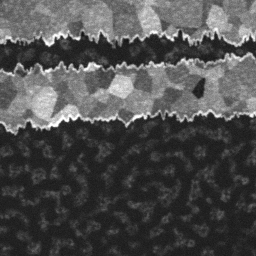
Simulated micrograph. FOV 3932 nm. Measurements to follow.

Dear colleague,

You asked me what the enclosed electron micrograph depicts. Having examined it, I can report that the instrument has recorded one or a few lines or trenches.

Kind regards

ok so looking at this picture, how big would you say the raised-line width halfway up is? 52.9 pixels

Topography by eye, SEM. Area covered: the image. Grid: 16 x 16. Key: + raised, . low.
++++++++++++++++
++++++++++++++++
++.....+......+.
................
++++++++++++++++
++++++++++++++++
++++++++++++++++
++++...+........
................
................
................
................
................
................
................
................